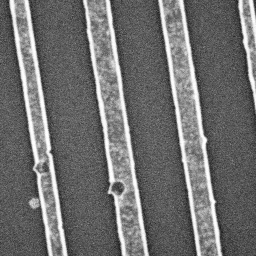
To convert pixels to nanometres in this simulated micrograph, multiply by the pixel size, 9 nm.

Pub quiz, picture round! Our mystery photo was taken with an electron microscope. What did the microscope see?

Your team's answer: one or a few lines or trenches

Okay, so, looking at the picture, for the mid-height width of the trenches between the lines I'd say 517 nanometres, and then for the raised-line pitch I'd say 675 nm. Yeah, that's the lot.